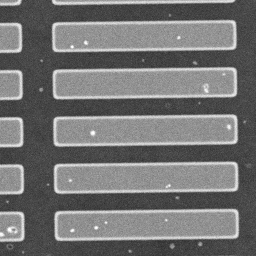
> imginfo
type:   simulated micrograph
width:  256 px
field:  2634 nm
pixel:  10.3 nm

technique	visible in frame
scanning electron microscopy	groups of lines, slits or small figures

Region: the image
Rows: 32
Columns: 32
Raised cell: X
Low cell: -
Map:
XX------------------------------
--------------------------------
--------------------------------
XXX----XXXXXXXXXXXXXXXXXXXXXX---
XXX----XXXXXXXXXXXXXXXXXXXXXX---
XXX----XXXXXXXXXXXXXXXXXXXXXX---
--------------------------------
--------------------------------
--------------------------------
XXX----XXXXXXXXXXXXXXXXXXXXXX---
XXX----XXXXXXXXXXXXXXXXXXXXXX---
XXX----XXXXXXXXXXXXXXXXXXXXXX---
--------------------------------
--------------------------------
---------------------------XX---
XXX----XXXXXXXXXXXXXXXXXXXXXX---
XXX----XXXXXXXXXXXXXXXXXXXXXX---
XXX----XXXXXXXXXXXXXXXXXXXXXX---
--------------------------------
--------------------------------
-------------------XXXXXXXXXX---
XXX----XXXXXXXXXXXXXXXXXXXXXXX--
XXX----XXXXXXXXXXXXXXXXXXXXXXX--
XXX----XXXXXXXXXXXXXXXXXXXXXX---
--------------------------------
--------------------------------
------------XXXXXXXXXXXXXXXXX---
XXX----XXXXXXXXXXXXXXXXXXXXXXX--
XXX----XXXXXXXXXXXXXXXXXXXXXXX--
XXX----XXXXXXXXXXXXXXXXXXXXXX---
--------------------------------
--------------------------------